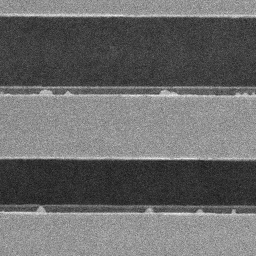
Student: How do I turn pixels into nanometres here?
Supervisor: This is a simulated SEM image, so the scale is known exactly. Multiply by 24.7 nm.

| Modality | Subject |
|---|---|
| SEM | lines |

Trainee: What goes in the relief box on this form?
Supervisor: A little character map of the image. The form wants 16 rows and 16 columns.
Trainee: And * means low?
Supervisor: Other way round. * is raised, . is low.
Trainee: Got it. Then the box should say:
****************
................
................
................
................
................
****************
****************
****************
****************
................
................
................
****************
****************
****************